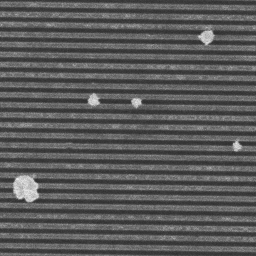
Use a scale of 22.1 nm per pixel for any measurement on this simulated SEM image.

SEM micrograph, parallel lines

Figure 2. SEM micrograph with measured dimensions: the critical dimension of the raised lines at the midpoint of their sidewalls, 105 nanometers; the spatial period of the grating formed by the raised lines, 223 nanometers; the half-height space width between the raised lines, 4.62 pixels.